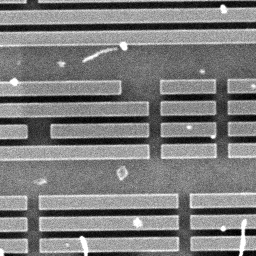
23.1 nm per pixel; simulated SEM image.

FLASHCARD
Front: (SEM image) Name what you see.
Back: groups of lines, slits or small figures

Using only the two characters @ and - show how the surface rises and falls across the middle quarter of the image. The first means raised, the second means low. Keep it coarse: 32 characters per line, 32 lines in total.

--------------------------------
--------------------------------
--------------------------------
--------------------------------
@@@@@@@@@@@@@@----------@@@@@@@@
@@@@@@@@@@@@@@----------@@@@@@@@
@@@@@@@@@@@@@@----------@@@@@@@@
@@@@@@@@@@@@@@------------------
--------------------------------
-------------------------@@@@@@@
@@@@@@@@@@@@@@@@@@@@@---@@@@@@@@
@@@@@@@@@@@@@@@@@@@@@---@@@@@@@@
@@@@@@@@@@@@@@@@@@@@@---@@@@@@@@
--------------------------------
--------------------------------
@@@@@@@@@@@@@@@@@@@@@---@@@@@@@@
@@@@@@@@@@@@@@@@@@@@@---@@@@@@@@
@@@@@@@@@@@@@@@@@@@@@---@@@@@@@@
--------------------------------
--------------------------------
@@@@@@@@@@@@@@@@@@@@@---@@@@@@@@
@@@@@@@@@@@@@@@@@@@@@---@@@@@@@@
@@@@@@@@@@@@@@@@@@@@@---@@@@@@@@
@@@@@@@@@@@@@@@@@@@@@----@@@@---
--------------------------------
--------------------------------
--------------------------------
--------------------------------
--------------------------------
--------------------------------
--------------------------------
--------------------------------